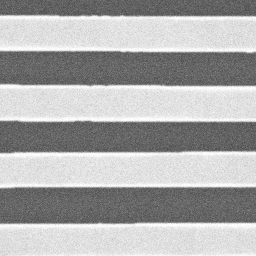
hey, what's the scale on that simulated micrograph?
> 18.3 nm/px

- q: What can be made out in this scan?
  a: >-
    lines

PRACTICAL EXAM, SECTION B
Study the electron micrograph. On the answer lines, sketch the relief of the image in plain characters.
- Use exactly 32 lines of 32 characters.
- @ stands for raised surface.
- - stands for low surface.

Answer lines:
--------------------------------
--------------------------------
@@@@@@@@@@@@@@@@@@@@@@@@@@@@@@@@
@@@@@@@@@@@@@@@@@@@@@@@@@@@@@@@@
@@@@@@@@@@@@@@@@@@@@@@@@@@@@@@@@
@@@@@@@@@@@@@@@@@@@@@@@@@@@@@@@@
--------------------------------
--------------------------------
--------------------------------
--------------------------------
--------------------------------
@@@@@@@@@@@@@@@@@@@@@@@@@@@@@@@@
@@@@@@@@@@@@@@@@@@@@@@@@@@@@@@@@
@@@@@@@@@@@@@@@@@@@@@@@@@@@@@@@@
@@@@@@@@@@@@@@@@@@@@@@@@@@@@@@@@
--------------------------------
--------------------------------
--------------------------------
--------------------------------
@@@@@@@@@@@@@@@@@@@@@@@@@@@@@@@@
@@@@@@@@@@@@@@@@@@@@@@@@@@@@@@@@
@@@@@@@@@@@@@@@@@@@@@@@@@@@@@@@@
@@@@@@@@@@@@@@@@@@@@@@@@@@@@@@@@
--------------------------------
--------------------------------
--------------------------------
--------------------------------
--------------------------------
@@@@@@@@@@@@@@@@@@@@@@@@@@@@@@@@
@@@@@@@@@@@@@@@@@@@@@@@@@@@@@@@@
@@@@@@@@@@@@@@@@@@@@@@@@@@@@@@@@
@@@@@@@@@@@@@@@@@@@@@@@@@@@@@@@@